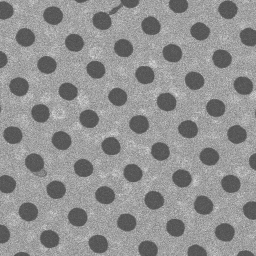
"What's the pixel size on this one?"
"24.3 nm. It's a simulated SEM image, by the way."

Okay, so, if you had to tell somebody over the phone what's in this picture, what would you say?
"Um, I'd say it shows a regular array of holes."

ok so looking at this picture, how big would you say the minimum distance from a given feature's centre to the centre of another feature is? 839 nanometres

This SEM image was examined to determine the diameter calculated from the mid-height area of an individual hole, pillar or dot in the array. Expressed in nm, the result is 464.